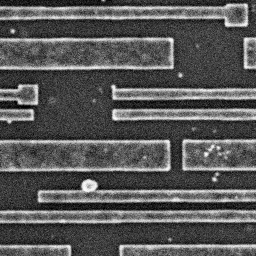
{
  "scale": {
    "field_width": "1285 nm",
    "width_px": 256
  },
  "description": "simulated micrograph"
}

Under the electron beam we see wiring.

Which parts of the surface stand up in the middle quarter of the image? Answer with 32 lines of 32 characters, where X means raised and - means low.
XXXXXXXXXXXXXXXXXXXXXXXXXXX-----
--------------------------------
--------------------------------
--------------------------------
--------------------------------
--------------------------------
-------------XXXXXXXXXXXXXXXXXXX
------------XXXXXXXXXXXXXXXXXXXX
------------XXXXXXXXXXXXXXXXXXXX
--------------------------------
--------------------------------
-------------XXXXXXXXXXXXXXXXXXX
------------XXXXXXXXXXXXXXXXXXXX
------------XXXXXXXXXXXXXXXXXXXX
--------------------------------
--------------------------------
--------------------------------
--------------------------------
--------------------------------
XXXXXXXXXXXXXXXXXXXXXXXXXX----XX
XXXXXXXXXXXXXXXXXXXXXXXXXX----XX
XXXXXXXXXXXXXXXXXXXXXXXXXX----XX
XXXXXXXXXXXXXXXXXXXXXXXXXX----XX
XXXXXXXXXXXXXXXXXXXXXXXXXX----XX
XXXXXXXXXXXXXXXXXXXXXXXXXX----XX
XXXXXXXXXXXXXXXXXXXXXXXXXX----XX
XXXXXXXXXXXXX-XXXXXXXXXXXX------
--------------------------------
--------------------------------
-----XX-------------------------
-----XXX------------------------
----XXXX------------------------